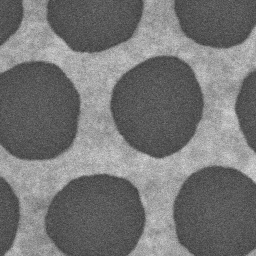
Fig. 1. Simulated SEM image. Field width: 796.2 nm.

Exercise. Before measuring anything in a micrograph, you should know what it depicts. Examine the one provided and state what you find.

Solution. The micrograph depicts holes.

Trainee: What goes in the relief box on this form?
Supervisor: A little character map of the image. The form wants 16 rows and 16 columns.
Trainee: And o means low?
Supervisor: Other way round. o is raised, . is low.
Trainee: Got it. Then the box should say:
.oo......oo.....
.oo......oo.....
oooo....oooo...o
oooooooooo.ooooo
....oooo....oooo
.....oo......oo.
.....oo......oo.
.....oo.....ooo.
.....ooo....ooo.
o...ooooo..ooooo
ooooooooooooo.oo
.ooo....ooo.....
.oo......oo.....
.oo......oo.....
.oo......oo.....
.ooo....oooo....